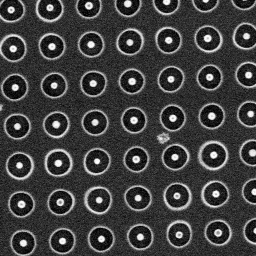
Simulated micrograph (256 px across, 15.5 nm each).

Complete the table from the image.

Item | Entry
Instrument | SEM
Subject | an array of small figures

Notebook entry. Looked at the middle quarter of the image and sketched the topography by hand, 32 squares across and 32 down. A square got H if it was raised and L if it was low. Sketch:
HHHHHHHHHHHHHHHHHHHHHHHHHHHHHHHH
HHHHHHHHHHHHHHHHLLHHHHHHHLLLLHHH
HHHHHHLLLHHHHHHLLLLHHHHHLLLLLHHH
HHHHHLLLLLHHHHLLLLLLHHHHLLHLLLHH
HHHHLLLHLLHHHHLLHHLLHHHHLLLLLLHH
LHHHLLLLLLHHHHLLLLLLHHHHLLLLLHHH
HHHHHLLLLLHHHHHLLLLHHHHHHLLLHHHH
HHHHHHLLLHHHHHHHHHHHHHHHHHHHHHHH
HHHHHHHHHHHHHHHHHHHHHHHHHHHHHHHH
HHHHHHHHHHHHHHHHHHHHHHHHHHHHHHHH
HHHHHHHHHHHHHHHHHHHHHHHHHHLHHHHH
HHHHHHHHHHHHHHHHLLLHHHHHHLLLLHHH
HHHHHHLLLLHHHHHLLLLLHHHHLLLLLLHH
LHHHHLLLLLLHHHHLLHLLHHHHLLLHLLHH
LHHHHLLHLLLHHHHLLHLLHHHHLLLLLLHH
LHHHHLLLLLLHHHHLLLLLHHHHHLLLLHHH
LHHHHLLLLLHHHHHHLLLHHHHHHHHLHHHH
HHHHHHHLLHHHHHHHHHHHHHHHHHHHHHHH
HHHHHHHHHHHHHHHHHHHHHHHHHHHHHHHH
HHHHHHHHHHHHHHHHHHHHHHHHHHHHHHHH
HHHHHHHHHHHHHHHHHHHHHHHHHHHLLHHH
HHHHHHHLLHHHHHHHLLLLHHHHHLLLLLHH
LHHHHHLLLLLHHHHHLLLLLHHHHLLLLLLH
LLHHHLLLLLLHHHHLLHHLLHHHHLLHLLLH
LLHHHLLLHLLHHHHLLLLLLHHHHLLLLLLH
LLHHHLLLLLLHHHHHLLLLHHHHHHLLLLHH
LHHHHHLLLLHHHHHHHLLHHHHHHHHHHHHH
HHHHHHHHHHHHHHHHHHHHHHHHHHHHHHHH
HHHHHHHHHHHHHHHHHHHHHHHHHHHHHHHH
HHHHHHHHHHHHHHHHHHHHHHHHHHHHHHHH
HHHHHHHHHHHHHHHHHHHHHHHHHHLLLLHH
HHHHHHHLLLLHHHHHLLLLLHHHHHLLLLLH